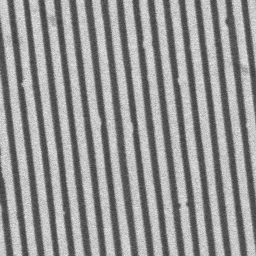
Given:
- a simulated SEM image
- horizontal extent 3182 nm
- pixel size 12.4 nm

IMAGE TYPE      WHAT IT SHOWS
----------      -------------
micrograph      parallel lines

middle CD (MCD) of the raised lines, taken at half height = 117 nanometres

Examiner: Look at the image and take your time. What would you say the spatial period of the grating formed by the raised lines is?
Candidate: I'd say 0.192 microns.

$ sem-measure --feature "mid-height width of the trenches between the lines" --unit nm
70.9